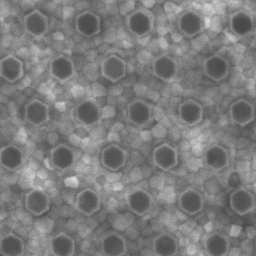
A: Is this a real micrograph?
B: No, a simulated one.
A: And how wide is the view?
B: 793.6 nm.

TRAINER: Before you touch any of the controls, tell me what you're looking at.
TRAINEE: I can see a regular array of raised bodies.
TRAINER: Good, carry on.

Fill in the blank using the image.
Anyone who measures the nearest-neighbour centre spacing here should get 0.158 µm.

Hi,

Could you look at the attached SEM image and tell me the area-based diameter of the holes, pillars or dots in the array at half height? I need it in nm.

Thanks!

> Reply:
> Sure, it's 75.9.